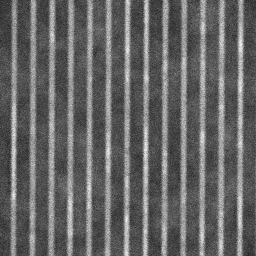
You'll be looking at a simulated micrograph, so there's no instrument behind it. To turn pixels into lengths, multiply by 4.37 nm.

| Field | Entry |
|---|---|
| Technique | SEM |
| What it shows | parallel lines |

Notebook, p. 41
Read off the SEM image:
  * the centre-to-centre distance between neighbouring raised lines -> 82.5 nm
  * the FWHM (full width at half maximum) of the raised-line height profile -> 15.3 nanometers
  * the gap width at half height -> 69.9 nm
